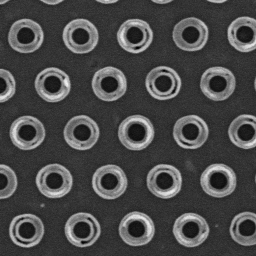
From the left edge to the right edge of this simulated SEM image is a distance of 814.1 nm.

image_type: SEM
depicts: a regular array of ring-shaped raised bodies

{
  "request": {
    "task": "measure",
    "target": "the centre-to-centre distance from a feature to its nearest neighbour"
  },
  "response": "172 nm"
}